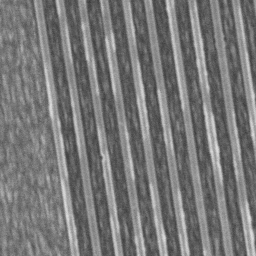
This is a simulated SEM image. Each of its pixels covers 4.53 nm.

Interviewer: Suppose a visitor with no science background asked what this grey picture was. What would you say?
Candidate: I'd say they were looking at parallel lines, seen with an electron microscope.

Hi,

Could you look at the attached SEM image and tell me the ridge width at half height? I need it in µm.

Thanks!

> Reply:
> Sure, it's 0.0352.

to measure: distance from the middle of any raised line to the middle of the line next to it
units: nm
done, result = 98.6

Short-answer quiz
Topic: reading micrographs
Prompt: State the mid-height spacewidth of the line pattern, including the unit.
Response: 14.6 px